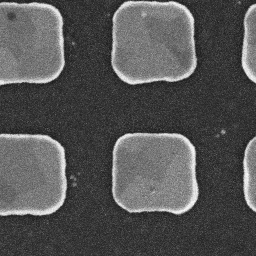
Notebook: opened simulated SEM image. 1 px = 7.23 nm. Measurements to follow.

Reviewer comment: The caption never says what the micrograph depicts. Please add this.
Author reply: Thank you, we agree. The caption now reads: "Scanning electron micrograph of raised bodies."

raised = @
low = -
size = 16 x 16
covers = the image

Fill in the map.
@@@-----@@@-----
@@@@---@@@@@---@
@@@@---@@@@@---@
@@@@---@@@@@---@
@@@@---@@@@@---@
----------------
----------------
----------------
@-------@@@-----
@@@@---@@@@@---@
@@@@---@@@@@---@
@@@@---@@@@@---@
@@@@---@@@@@---@
----------------
----------------
----------------